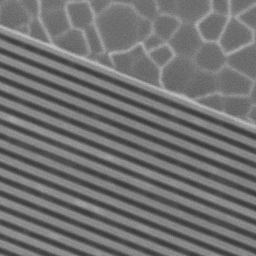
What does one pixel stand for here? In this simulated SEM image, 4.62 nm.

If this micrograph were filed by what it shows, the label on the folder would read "parallel lines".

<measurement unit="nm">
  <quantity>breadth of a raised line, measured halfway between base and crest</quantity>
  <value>32.3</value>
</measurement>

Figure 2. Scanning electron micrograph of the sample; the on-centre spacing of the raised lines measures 61.4 nanometres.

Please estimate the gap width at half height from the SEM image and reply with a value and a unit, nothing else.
32.3 nm